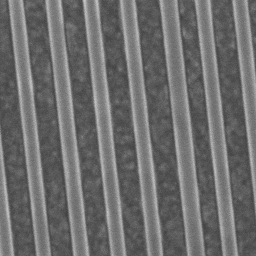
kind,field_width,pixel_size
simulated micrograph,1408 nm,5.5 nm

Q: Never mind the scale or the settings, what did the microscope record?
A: parallel lines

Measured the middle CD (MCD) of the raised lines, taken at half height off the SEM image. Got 80 nm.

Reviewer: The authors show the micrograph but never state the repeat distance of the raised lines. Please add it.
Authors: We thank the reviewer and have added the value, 204 nanometers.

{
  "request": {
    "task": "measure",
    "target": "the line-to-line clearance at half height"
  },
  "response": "22.2 pixels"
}